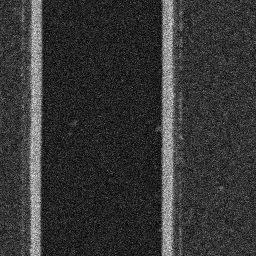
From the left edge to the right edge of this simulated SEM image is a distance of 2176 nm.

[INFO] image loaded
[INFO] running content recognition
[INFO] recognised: one or a few lines or trenches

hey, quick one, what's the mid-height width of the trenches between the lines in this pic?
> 132 pixels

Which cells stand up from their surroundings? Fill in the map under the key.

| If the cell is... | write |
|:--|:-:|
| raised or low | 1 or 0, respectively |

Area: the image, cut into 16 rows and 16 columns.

1100000000011111
1100000000011111
1100000000111111
1100000000111111
1100000000011111
1100000000011111
1100000000011111
1100000000011111
1100000000011111
1100000000011111
1100000000011111
1100000000011111
1100000000011111
1100000000011111
1100000000011111
1100000000011111